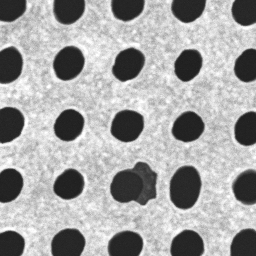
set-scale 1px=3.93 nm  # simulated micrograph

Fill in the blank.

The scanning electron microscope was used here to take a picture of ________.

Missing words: a regular array of holes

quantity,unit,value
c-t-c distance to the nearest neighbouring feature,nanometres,234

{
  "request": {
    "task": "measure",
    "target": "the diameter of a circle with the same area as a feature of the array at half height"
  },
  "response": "0.123 microns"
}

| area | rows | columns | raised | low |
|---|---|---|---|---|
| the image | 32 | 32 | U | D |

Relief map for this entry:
DDDUUUUDDDDUUUDDDDUUUDDDDDUUUDDD
DDDUUUUDDDUUUUDDDDUUUUDDDUUUUDDD
DDUUUUUDDDUUUUUDUUUUUUDDUUUUUDDD
UUUUUUUUUUUUUUUUUUUUUUUUUUUUUUUU
UUUUUUUUUUUUUUUUUUUUUUUUUUUUUUUU
UUUUUUUUUUUUUUUUUUUUUUUUUUUUUUUU
DDUUUUUDDDUUUUUDDDUUUUUDDUUUUUDD
DDDUUUUDDDDUUUDDDDUUUUDDDUUUUUDD
DDDUUUUDDDUUUUDDDDUUUUDDDUUUUDDD
DDUUUUUDDDUUUUDDDUUUUUDDUUUUUUDD
UUUUUUUUUUUUUUUUUUUUUUUUUUUUUUUU
UUUUUUUUUUUUUUUUUUUUUUUUUUUUUUUU
UUUUUUUUUUUUUUUUUUUUUUUUUUUUUUUU
DDUUUUUUUUUUUUUUUUUUUUUUUUUUUUUU
DDDUUUUDDDUUUUDDDDUUUUDDDUUUUUDD
DDDUUUUDDDUUUUDDDDUUUUDDDUUUUDDD
DDDUUUUDDDUUUUDDDDUUUUDDDUUUUDDD
DDUUUUUUDUUUUUUDDUUUUUDDUUUUUUDD
UUUUUUUUUUUUUUUUUUUUUUUUUUUUUUUU
UUUUUUUUUUUUUUUUUUUUUUUUUUUUUUUU
UUUUUUUUUUUUUUUUUDUUUUUUUUUUUUUU
DDUUUUUUDDUUUUUDDDDUUUDDDUUUUUUD
DDDUUUUDDDUUUUDDDDDDUDDDDUUUUUDD
DDDUUUUDDDUUUUDDDDDDUDDDDUUUUDDD
DDUUUUUDDDUUUUDDDDDUUDDDDUUUUDDD
UUUUUUUUUUUUUUUUUDUUUUDDUUUUUUUD
UUUUUUUUUUUUUUUUUUUUUUUUUUUUUUUU
UUUUUUUUUUUUUUUUUUUUUUUUUUUUUUUU
UUUUUUUUUUUUUUUUUUUUUUUUUUUUUUUU
DDDUUUUDDDUUUUDDDUUUUUDDDUUUUDDD
DDDUUUDDDDDUUUDDDDUUUDDDDUUUUDDD
DDDUUUDDDDUUUUDDDDUUUDDDDUUUUDDD